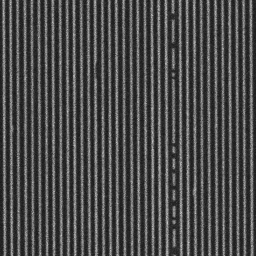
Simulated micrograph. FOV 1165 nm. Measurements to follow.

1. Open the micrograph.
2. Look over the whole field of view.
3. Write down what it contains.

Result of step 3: parallel lines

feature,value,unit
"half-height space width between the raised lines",21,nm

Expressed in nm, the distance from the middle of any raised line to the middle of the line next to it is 32.2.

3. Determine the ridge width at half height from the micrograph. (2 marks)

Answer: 12.5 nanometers